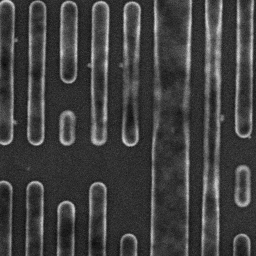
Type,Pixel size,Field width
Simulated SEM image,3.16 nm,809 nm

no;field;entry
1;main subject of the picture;groups of lines, slits or small figures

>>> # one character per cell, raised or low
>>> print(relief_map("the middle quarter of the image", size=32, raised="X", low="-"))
XXX----XXXX----XXX-----XXXXXXXX-
XXX----XXXX----XXX-----XXXXXXXX-
XXX----XXXX----XXX-----XXXXXXXX-
XXX----XXXX----XXX-----XXXXXXXX-
XX-----XXXX----XXX-----XXXXXXXX-
-------XXXX----XXX-----XXXXXXXX-
-------XXXX----XXX-----XXXXXXXX-
-------XXXX----XXX-----XXXXXXXX-
-------XXXX----XXX-----XXXXXXXX-
-------XXXX----XXX-----XXXXXXXX-
-------XXX-----XXX-----XXXXXXXX-
-------XXX-----XXX-----XXXXXXXX-
XX-----XXX-----XXX-----XXXXXXXX-
XX-----XXX-----XXX-----XXXXXXXX-
XX-----XXX-----XXX-----XXXXXXXX-
XX-----XXX-----XXX-----XXXXXXXX-
XX-----XXX-----XXX-----XXXXXXXX-
XX-----XXX-----XXX-----XXXXXXXX-
XX-----XXX-----XXX----XXXXXXXXX-
XX------XX-----XXX----XXXXXXXXX-
----------------------XXXXXXXXX-
----------------------XXXXXXXXX-
----------------------XXXXXXXXX-
----------------------XXXXXXXXX-
----------------------XXXXXXXXX-
----------------------XXXXXXXXX-
----------------------XXXXXXXXX-
----------------------XXXXXXXXX-
----------------------XXXXXXXXX-
----------------------XXXXXXXXX-
-------XXX------------XXXXXXXXX-
-------XXX------------XXXXXXXXX-